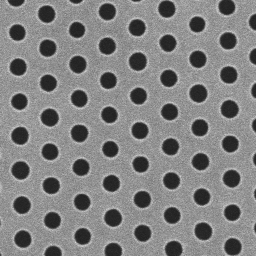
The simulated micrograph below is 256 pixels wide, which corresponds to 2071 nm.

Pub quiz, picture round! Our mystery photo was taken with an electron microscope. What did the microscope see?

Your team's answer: a regular array of holes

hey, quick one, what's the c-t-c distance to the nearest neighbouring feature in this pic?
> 275 nm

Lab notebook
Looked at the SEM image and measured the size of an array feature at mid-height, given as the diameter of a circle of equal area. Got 139 nm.